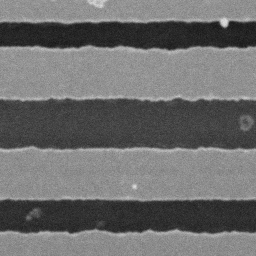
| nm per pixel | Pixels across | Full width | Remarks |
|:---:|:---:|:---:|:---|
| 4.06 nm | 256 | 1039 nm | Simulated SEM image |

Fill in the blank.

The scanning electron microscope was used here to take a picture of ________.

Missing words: lines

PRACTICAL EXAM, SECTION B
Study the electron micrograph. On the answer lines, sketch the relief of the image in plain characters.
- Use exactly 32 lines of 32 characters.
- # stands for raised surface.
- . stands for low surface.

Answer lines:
################################
################################
################################
................................
................................
................................
################################
################################
################################
################################
################################
################################
...................#...##.......
................................
................................
................................
................................
................................
...#............................
################################
################################
################################
################################
################################
################################
................................
................................
................................
................................
################################
################################
################################